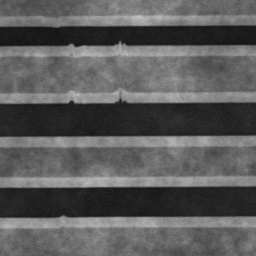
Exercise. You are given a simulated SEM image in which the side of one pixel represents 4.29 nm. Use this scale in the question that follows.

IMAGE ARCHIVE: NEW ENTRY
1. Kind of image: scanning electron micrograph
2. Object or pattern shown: one or a few lines or trenches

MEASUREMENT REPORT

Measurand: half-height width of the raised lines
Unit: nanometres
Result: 187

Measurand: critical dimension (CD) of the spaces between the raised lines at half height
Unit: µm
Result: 0.173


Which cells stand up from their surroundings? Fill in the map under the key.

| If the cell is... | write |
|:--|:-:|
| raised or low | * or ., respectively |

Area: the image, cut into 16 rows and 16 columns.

****************
................
................
****************
****************
****************
................
................
................
****************
****************
................
................
................
****************
****************